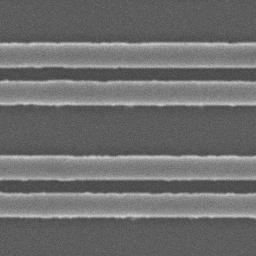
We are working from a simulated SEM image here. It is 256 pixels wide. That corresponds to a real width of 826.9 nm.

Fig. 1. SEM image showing lines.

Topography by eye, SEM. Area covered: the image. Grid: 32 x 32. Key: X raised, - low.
--------------------------------
--------------------------------
--------------------------------
--------------------------------
--------------------------------
XXXXXXXXXXXXXXXX-XXXXXXXXXXXXXXX
XXXXXXXXXXXXXXXXXXXXXXXXXXXXXXXX
XXXXXXXXXXXXXXXXXXXXXXXXXXXXXXXX
--------------------------------
--------------------------------
XXXXXXXXXXXXXXXXXXXXXXXXXXXXXXXX
XXXXXXXXXXXXXXXXXXXXXXXXXXXXXXXX
XXXXXXXXXXXXXXXXXXXXXXXXXXXXXXXX
--------------------------------
--------------------------------
--------------------------------
--------------------------------
--------------------------------
--------------------------------
--------------------------------
XXXXXXXXXXXXXXXXXXXXXXXXXXXXXXXX
XXXXXXXXXXXXXXXXXXXXXXXXXXXXXXXX
--------------------------------
--------------------------------
XXXXXXXXXXXXXXXXXXXXXXXXXXXXXXXX
XXXXXXXXXXXXXXXXXXXXXXXXXXXXXXXX
XXXXXXXXXXXXXXXXXXXXXXXXXXXXXXXX
--------------------------------
--------------------------------
--------------------------------
--------------------------------
--------------------------------